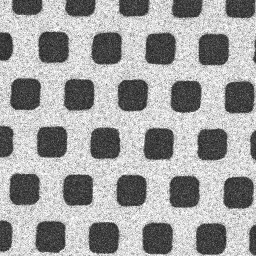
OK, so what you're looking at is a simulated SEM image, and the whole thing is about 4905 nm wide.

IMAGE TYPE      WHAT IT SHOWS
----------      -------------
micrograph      a regular array of holes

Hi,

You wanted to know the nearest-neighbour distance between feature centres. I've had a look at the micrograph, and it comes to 1.02 micrometres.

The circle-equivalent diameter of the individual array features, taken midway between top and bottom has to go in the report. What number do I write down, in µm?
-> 0.641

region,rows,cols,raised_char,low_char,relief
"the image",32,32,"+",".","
+....+++....+++....+++...+++....
++...+++....+++...++++...+++....
++++++++++++++++++++++++++++++++
++++++++++++++++++++++++++++++++
.++++...++++...++++...+++...++++
..+++....+++...+++....+++....+++
..+++....++....+++....+++....+++
.++++...++++...+++....+++...++++
++++++++++++++++++++++++++++++++
++++++++++++++++++++++++++++++++
+....+++....+++...++++...++++..+
+....+++....+++...+++....+++....
+....+++....+++...+++....+++....
++...+++...++++...++++...+++....
++++++++++++++++++++++++++++++++
++++++++++++++++++++++++++++++++
..+++...++++...+++....+++...++++
..+++...+++....+++....+++...+++.
..+++...+++....+++....+++...+++.
.++++...++++...+++...++++...+++.
++++++++++++++++++++++++++++++++
++++++++++++++++++++++++++++++++
+....+++....+++...+++....+++...+
+....+++....+++...+++....+++....
+....+++....+++...+++....+++....
++..++++...++++...+++....+++...+
++++++++++++++++++++++++++++++++
++++++++++++++++++++++++++++++++
.++++...+++....+++...++++...+++.
..+++...+++....+++....++....+++.
.+++....+++....+++....+++...+++.
+++++..+++++..++++...++++...+++.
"